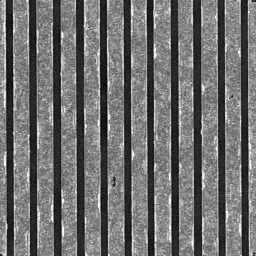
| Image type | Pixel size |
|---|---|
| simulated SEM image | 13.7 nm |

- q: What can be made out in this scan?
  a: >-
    parallel lines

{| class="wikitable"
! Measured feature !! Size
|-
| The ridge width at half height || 215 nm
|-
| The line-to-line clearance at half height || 0.103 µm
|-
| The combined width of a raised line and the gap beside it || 320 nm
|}